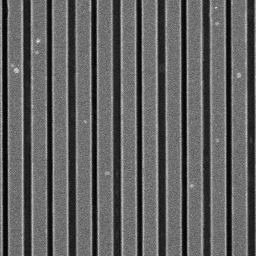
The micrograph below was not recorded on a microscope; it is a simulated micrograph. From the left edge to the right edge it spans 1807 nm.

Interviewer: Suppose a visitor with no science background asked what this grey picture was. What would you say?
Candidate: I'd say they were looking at parallel lines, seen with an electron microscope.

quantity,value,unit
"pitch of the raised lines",158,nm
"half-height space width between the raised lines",44.6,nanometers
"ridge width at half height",109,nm